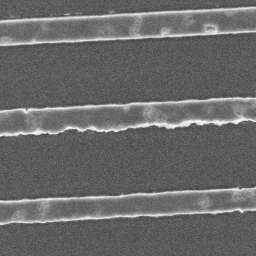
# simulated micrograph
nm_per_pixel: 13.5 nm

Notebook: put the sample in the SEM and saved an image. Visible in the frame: one or a few lines or trenches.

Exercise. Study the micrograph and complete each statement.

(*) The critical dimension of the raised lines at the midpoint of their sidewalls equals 318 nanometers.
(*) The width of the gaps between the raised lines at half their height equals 878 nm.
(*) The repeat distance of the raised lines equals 1.21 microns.